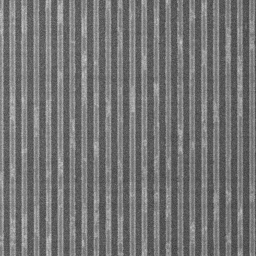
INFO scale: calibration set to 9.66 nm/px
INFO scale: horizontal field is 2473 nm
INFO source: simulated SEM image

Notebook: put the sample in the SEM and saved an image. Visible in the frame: parallel lines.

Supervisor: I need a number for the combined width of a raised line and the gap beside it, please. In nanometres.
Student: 116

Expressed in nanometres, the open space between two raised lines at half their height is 72.5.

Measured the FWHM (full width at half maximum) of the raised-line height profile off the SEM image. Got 36.2 nanometres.